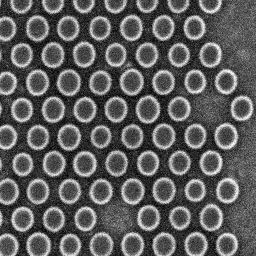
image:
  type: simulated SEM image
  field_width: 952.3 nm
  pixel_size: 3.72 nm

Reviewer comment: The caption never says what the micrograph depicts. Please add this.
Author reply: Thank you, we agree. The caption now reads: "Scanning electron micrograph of a regular array of raised bodies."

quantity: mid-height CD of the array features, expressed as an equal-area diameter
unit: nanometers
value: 81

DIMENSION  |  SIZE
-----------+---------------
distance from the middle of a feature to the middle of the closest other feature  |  115 nm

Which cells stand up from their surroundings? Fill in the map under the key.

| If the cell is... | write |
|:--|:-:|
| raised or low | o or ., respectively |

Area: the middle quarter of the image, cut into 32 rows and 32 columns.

....oo......oo......o...........
................oo..............
ooo.....ooo....oooo....oooo....o
oooo...oooo...ooooo....oooo...oo
oooo...ooooo..oooooo..ooooo...oo
oooo...oooo...ooooo...ooooo...oo
ooo....oooo....oooo....oooo....o
oo..............oo..............
....................oo......oo..
...oooo....oooo....oooo....oooo.
...ooooo..ooooo...oooooo..ooooo.
...ooooo..ooooo...oooooo..ooooo.
...ooooo...oooo...ooooo....oooo.
...oooo....oooo....oooo....ooo..
....................oo..........
oo...............o......oo......
ooo.....ooo....oooo....oooo....o
oooo...oooo....oooo....oooo....o
oooo...oooo....oooo....oooo....o
oooo...oooo....oooo....oooo....o
ooo.....oo......ooo....ooo......
................................
....oo......ooo.....ooo.....ooo.
...oooo....oooo....oooo....oooo.
...ooooo...ooooo...ooooo...oooo.
...ooooo...ooooo...ooooo...oooo.
...oooo....oooo....oooo....oooo.
....oo......oo......oo......o...
................................
ooo.....ooo.....ooo....oooo.....
oooo...ooooo...ooooo...ooooo...o
oooo...ooooo...ooooo..oooooo...o